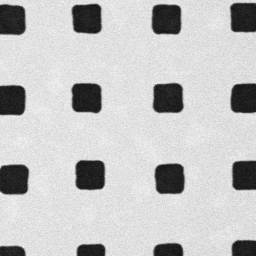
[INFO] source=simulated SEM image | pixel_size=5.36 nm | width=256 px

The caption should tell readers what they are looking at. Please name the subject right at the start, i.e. holes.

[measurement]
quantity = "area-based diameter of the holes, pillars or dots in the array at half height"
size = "0.174 microns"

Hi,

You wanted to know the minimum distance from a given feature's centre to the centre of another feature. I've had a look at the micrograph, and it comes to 0.42 um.